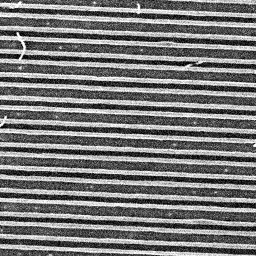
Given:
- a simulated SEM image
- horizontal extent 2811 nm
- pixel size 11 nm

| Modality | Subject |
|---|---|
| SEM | parallel lines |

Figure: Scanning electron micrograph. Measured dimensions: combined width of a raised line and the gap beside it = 11.5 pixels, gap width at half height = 72.7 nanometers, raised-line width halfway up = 3.75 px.